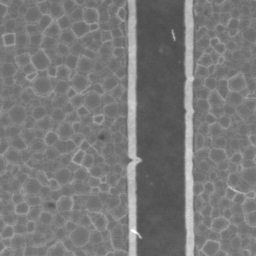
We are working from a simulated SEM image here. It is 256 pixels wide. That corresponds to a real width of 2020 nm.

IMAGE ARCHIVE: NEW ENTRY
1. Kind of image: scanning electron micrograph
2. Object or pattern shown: one or a few lines or trenches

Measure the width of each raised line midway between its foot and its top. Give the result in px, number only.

57.2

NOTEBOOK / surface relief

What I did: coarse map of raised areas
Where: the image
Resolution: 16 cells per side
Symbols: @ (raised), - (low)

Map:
--------@@@@----
--------@@@@----
--------@@@@----
--------@@@@----
--------@@@@----
--------@@@@----
--------@@@@----
--------@@@@----
--------@@@@----
--------@@@@----
--------@@@@----
--------@@@@----
--------@@@@----
--------@@@@----
--------@@@@----
--------@@@@----